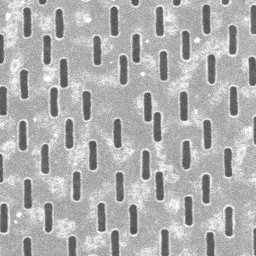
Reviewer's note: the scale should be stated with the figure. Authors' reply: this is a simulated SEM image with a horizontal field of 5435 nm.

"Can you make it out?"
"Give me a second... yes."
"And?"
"a regular array of holes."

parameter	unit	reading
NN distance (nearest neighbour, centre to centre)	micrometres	0.682